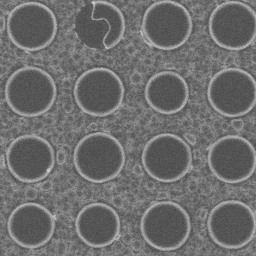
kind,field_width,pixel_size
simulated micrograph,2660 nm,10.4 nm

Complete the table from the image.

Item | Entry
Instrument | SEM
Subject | a regular array of raised bodies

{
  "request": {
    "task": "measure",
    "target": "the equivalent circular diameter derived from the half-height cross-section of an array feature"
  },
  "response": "0.484 microns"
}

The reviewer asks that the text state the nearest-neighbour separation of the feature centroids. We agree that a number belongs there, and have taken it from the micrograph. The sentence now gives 0.681 µm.